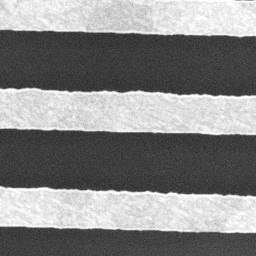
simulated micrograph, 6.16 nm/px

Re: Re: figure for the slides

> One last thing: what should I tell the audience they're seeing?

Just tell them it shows lines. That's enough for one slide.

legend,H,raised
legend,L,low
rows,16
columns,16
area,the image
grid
HHHHHHHHHHHHHHHH
HHHHHHHHHHHHHHHH
LLLLLLLLLLLLLLLL
LLLLLLLLLLLLLLLL
LLLLLLLLLLLLLLLL
LLLLLLLLLLLLLLLL
HHHHHHHHHHHHHHHH
HHHHHHHHHHHHHHHH
LLLLLLLLLLLLLLLL
LLLLLLLLLLLLLLLL
LLLLLLLLLLLLLLLL
LLLLLLLLLLLLLLLL
HHHHHHHHHHHHHHHH
HHHHHHHHHHHHHHHH
LLLLLLLLLLLLLLLL
LLLLLLLLLLLLLLLL